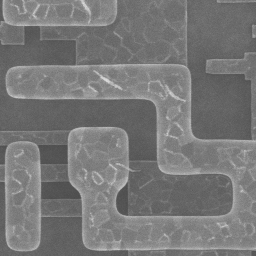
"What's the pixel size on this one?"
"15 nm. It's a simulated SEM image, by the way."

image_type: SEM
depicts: wiring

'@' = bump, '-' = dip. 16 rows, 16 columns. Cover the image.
@@@@@@@---------
-@@@@@@---------
----------------
----------------
-@@@@@@@@@@@----
@@@@@@@@@@@@----
----------@@----
----------@@----
----@@@@--@@----
@@--@@@@--@@@@@@
@@@-@@@@--@@@@@@
@@@--@@@------@@
@@@--@@--------@
@@@--@@@-----@@@
@@@--@@@@@@@@@@@
-@----@@@@@@@@@@